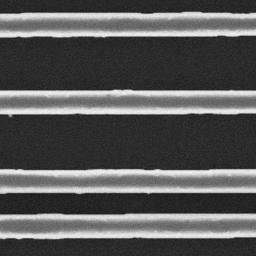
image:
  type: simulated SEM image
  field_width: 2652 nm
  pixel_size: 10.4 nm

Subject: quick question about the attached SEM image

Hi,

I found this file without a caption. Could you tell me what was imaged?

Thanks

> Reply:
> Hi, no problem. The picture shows lines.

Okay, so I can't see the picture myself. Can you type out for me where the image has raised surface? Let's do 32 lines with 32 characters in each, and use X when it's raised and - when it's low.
--------------------------------
--------------------------------
XXXXXXXXXXXXXXXXXXXXXXXXXXXXXXXX
XXXXXXXXXXXXXXXXXXXXXXXXXXXXXXXX
--------------------------------
--------------------------------
--------------------------------
--------------------------------
--------------------------------
--------------------------------
--------------------------------
---------------XX---------------
XXXXXXXXXXXXXXXXXXXXXXXXXXXXXXXX
XXXXXXXXXXXXXXXXXXXXXXXXXXXXXXXX
--------------------------------
--------------------------------
--------------------------------
--------------------------------
--------------------------------
--------------------------------
--------------------------------
XXXXXXX-XXXXXXXXXXXXXXXXXXXXXXXX
XXXXXXXXXXXXXXXXXXXXXXXXXXXXXXXX
XXXXXXXXXXXXXXXXXXXXXXXXXXXXXXXX
--------------------------------
--------------------------------
--------------------------------
XXXXXXXXXXXXXXXXXXXXXXXXXXXXXXXX
XXXXXXXXXXXXXXXXXXXXXXXXXXXXXXXX
XXXXXXXXXXXXX------XXXX---XX----
--------------------------------
--------------------------------